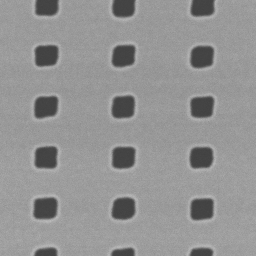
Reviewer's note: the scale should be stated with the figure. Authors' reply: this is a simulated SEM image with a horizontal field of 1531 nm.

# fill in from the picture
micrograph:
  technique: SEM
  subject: a regular array of holes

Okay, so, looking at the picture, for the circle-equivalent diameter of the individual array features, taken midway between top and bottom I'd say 144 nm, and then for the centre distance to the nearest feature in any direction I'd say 303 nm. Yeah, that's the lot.